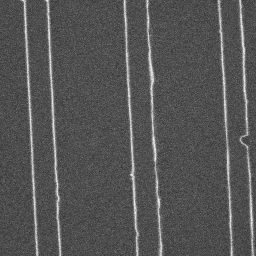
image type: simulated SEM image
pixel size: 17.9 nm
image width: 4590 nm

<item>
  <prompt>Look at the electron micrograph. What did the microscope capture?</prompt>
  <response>one or a few lines or trenches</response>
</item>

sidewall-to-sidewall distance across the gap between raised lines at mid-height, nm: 1340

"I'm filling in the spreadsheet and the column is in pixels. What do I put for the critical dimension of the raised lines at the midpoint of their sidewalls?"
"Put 23.2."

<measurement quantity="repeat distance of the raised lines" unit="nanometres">1740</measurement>